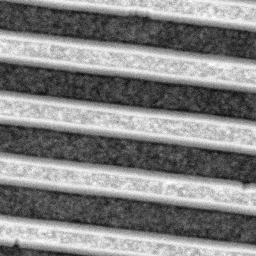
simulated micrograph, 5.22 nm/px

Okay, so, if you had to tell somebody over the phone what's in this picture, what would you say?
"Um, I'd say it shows parallel lines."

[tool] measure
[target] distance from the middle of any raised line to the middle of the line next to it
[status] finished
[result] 318 nm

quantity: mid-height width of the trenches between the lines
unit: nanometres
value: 194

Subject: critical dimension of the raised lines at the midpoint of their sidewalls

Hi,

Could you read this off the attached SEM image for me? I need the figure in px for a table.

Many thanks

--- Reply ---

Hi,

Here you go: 23.8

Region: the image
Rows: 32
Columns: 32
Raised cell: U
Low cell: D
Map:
DDDDDDDUUUUUUUUUUUUUUUUUUUUUUUUU
DDDDDDDDDDDDDDDDDUUUUUUUUUUUUUUU
DDDDDDDDDDDDDDDDDDDDDDDDUUUUUUUU
DDDDDDDDDDDDDDDDDDDDDDDDDDDDDDDD
UUDDDDDDDDDDDDDDDDDDDDDDDDDDDDDD
UUUUUUUUUUDDDDDDDDDDDDDDDDDDDDDD
UUUUUUUUUUUUUUUUUUUUDDDDDDDDDDDD
DDUUUUUUUUUUUUUUUUUUUUUUUUUUDDDD
DDDDDDDDDDUUUUUUUUUUUUUUUUUUUUUU
DDDDDDDDDDDDDDDDDDDUUUUUUUUUUUUU
DDDDDDDDDDDDDDDDDDDDDDDDDDDUUUUU
DDDDDDDDDDDDDDDDDDDDDDDDDDDDDDDD
UUUUUDDDDDDDDDDDDDDDDDDDDDDDDDDD
UUUUUUUUUUUUUUDDDDDDDDDDDDDDDDDD
UUUUUUUUUUUUUUUUUUUUUUDDDDDDDDDD
DDDDDUUUUUUUUUUUUUUUUUUUUUUUUUDD
DDDDDDDDDDDDDUUUUUUUUUUUUUUUUUUU
DDDDDDDDDDDDDDDDDDDDDUUUUUUUUUUU
DDDDDDDDDDDDDDDDDDDDDDDDDDDDDDUU
DDDDDDDDDDDDDDDDDDDDDDDDDDDDDDDD
UUUUUUUUDDDDDDDDDDDDDDDDDDDDDDDD
UUUUUUUUUUUUUUUUDDDDDDDDDDDDDDDD
DUUUUUUUUUUUUUUUUUUUUUUUDDDDDDDD
DDDDDDDDDUUUUUUUUUUUUUUUUUUUUUUD
DDDDDDDDDDDDDDDDDDUUUUUUUUUUUUUU
DDDDDDDDDDDDDDDDDDDDDDDDDUUUUUUU
DDDDDDDDDDDDDDDDDDDDDDDDDDDDDDDD
UDDDDDDDDDDDDDDDDDDDDDDDDDDDDDDD
UUUUUUUUUDDDDDDDDDDDDDDDDDDDDDDD
UUUUUUUUUUUUUUUUUUDDDDDDDDDDDDDD
DDDUUUUUUUUUUUUUUUUUUUUUUUDDDDDD
DDDDDDDDDDDUUUUUUUUUUUUUUUUUUUUU